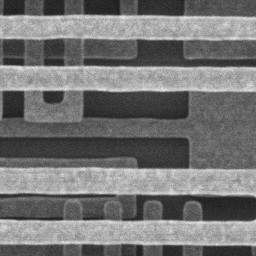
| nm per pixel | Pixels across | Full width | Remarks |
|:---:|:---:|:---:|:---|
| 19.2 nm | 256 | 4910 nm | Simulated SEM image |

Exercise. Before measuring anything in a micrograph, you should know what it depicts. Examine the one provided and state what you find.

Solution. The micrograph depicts wiring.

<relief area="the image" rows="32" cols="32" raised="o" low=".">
...oo...oo......................
...oo...oo......................
oooooooooooooooooooooooooooooooo
oooooooooooooooooooooooooooooooo
oooooooooooooooooooooooooooooooo
...oo...oo......................
...oo...oo......................
...oo...oo......................
ooooooooooooooooooooooo.oooooooo
oooooooooooooooooooooooooooooooo
oooooooooooooooooooooooooooooooo
...oo...ooo.....................
...oo...oo......................
...ooooooo......................
...ooooooo......................
................................
................................
................................
................................
................................
................................
oooooooooooooooooooooooooooooooo
oooooooooooooooooooooooooooooooo
oooooooooooooooooooooooooooooooo
................................
........oo...oo...oo...oo.......
........oo...oo...oo...oo.......
........ooo..ooo..ooo..ooo......
oooooooooooooooooooooooooooooooo
oooooooooooooooooooooooooooooooo
........ooo..oo..ooooooooooooooo
........oo...oo...oo...oo.......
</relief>